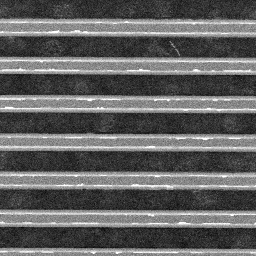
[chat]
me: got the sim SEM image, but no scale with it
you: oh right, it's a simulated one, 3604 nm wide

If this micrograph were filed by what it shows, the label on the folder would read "parallel lines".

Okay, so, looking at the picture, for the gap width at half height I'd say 343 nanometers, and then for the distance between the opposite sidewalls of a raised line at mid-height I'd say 185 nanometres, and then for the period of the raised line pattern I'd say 0.538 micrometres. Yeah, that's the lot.